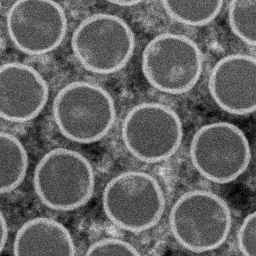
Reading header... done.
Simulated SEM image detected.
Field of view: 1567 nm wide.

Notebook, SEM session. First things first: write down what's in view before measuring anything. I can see a regular array of raised bodies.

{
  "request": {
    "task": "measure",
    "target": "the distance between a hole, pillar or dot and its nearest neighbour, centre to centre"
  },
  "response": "0.433 micrometres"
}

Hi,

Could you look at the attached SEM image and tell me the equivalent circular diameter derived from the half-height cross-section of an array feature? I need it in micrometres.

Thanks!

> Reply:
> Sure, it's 0.346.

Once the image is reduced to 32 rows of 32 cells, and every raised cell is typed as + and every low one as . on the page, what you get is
..+++++..............+++++++.+++
.+++++++.............++++++..+++
.+++++++...++++........+++...+++
.+++++++..++++++.............+++
..++++++.+++++++..............++
..+++++..+++++++...+++++........
....+.....++++++..+++++++.......
..........++++++..+++++++...++++
+++........++++...+++++++..+++++
+++++.............+++++++..+++++
+++++..............+++++..++++++
++++++..+++++..............+++++
++++++.+++++++.............+++++
+++++..+++++++...+++........++++
++++...+++++++..++++++..........
.......+++++++..++++++..........
........+++++...++++++...+++++..
++........++....++++++..+++++++.
+++.............++++++..+++++++.
+++...++++.......++++...+++++++.
+++..++++++.............+++++++.
+++..++++++..............+++++..
++..+++++++...+++++........+....
+....++++++..+++++++............
.....++++++..+++++++...++++.....
......++++...+++++++..++++++....
.............+++++++..++++++....
..............+++++...+++++++..+
+..+++++........++....++++++..++
+.+++++++.............++++++..++
..+++++++...++++.......++++...++
..+++++++..++++++..............+